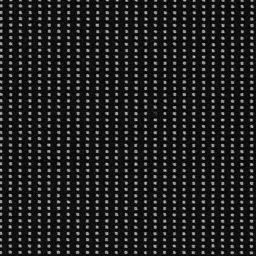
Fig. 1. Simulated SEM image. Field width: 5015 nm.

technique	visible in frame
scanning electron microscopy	a regular array of raised bodies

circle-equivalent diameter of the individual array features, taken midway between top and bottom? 54.1 nanometres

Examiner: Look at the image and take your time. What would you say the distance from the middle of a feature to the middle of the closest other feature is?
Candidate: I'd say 118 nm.